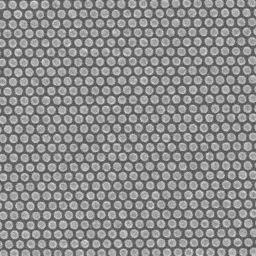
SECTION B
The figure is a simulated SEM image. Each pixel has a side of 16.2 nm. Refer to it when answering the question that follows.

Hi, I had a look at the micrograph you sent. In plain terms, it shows a regular array of raised bodies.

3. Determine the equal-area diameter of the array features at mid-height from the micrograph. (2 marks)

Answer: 126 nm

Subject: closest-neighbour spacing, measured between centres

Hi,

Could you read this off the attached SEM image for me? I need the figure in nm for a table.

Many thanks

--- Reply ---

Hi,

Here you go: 169